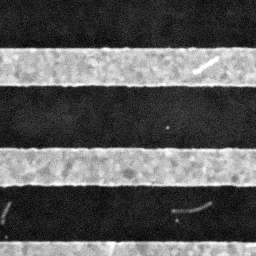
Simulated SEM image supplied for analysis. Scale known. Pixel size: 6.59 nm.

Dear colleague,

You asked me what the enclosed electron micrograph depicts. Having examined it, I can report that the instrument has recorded lines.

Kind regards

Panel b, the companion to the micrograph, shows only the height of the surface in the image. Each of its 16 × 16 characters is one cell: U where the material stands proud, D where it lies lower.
DDDDDDDDDDDDDDDD
DDDDDDDDDDDDDDDD
DDDDDDDDDDDDDDDD
UUUUUUUUUUUUUUUU
UUUUUUUUUUUUUUUU
DDDDDDDDDDDDDDDD
DDDDDDDDDDDDDDDD
DDDDDDDDDDDDDDDD
DDDDDDDDDDDDDDDD
UUUUUUUUUUUUUUUU
UUUUUUUUUUUUUUUU
UUUUUUUUUUUUUUUU
DDDDDDDDDDDDDDDD
DDDDDDDDDDDDDDDD
DDDDDDDDDDDDDDDD
UUUUUUUUUUUUUUUU